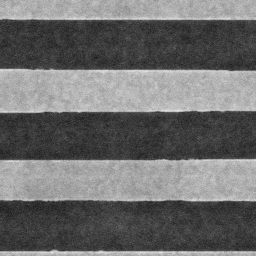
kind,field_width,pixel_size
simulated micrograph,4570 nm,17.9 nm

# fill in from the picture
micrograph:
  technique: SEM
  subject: lines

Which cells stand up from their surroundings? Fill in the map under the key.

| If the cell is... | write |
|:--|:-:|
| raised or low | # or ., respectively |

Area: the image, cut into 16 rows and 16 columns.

################
................
................
................
################
################
################
................
................
................
################
################
.###..##########
................
................
................